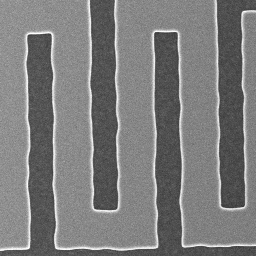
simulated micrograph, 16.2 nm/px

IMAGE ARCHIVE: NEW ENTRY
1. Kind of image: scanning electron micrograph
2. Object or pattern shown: groups of lines, slits or small figures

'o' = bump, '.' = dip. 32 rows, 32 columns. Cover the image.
ooooooooooo...ooooooooooooo.....
ooooooooooo...ooooooooooooo....o
ooooooooooo...ooooooooooooo...oo
ooooooooooo....oooooooooooo...oo
oooo..ooooo...ooooo...ooooo...oo
ooo....oooo...ooooo...ooooo...oo
ooo...ooooo....oooo...ooooo...oo
ooo...ooooo....oooo...ooooo...oo
ooo....oooo....oooo...ooooo...oo
ooo....oooo...ooooo...ooooo...oo
ooo....oooo....oooo....oooo...oo
ooo....oooo....oooo....oooo...oo
ooo....oooo....oooo....oooo....o
ooo....oooo....oooo....oooo....o
ooo....oooo....oooo....oooo....o
oooo...oooo....oooo....oooo....o
oooo...oooo....ooooo...oooo....o
oooo...ooooo...ooooo...oooo....o
oooo...ooooo...oooo....oooo....o
oooo...ooooo...oooo....oooo....o
oooo...ooooo...oooo....oooo....o
oooo...ooooo...oooo....oooo....o
oooo...ooooo...oooo....ooooo...o
oooo...ooooo...ooooo...ooooo...o
oooo...ooooo...ooooo...ooooo...o
oooo...ooooo...ooooo...ooooo...o
oooo...ooooooooooooo...ooooooooo
oooo...ooooooooooooo...ooooooooo
oooo...ooooooooooooo...ooooooooo
oooo...ooooooooooooo...ooooooooo
oooo...ooooooooooooo...ooooooooo
................................